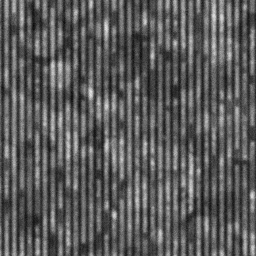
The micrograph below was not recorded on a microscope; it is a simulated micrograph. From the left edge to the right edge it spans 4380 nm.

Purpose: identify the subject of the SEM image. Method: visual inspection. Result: parallel lines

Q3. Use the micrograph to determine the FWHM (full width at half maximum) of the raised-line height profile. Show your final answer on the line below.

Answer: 59.9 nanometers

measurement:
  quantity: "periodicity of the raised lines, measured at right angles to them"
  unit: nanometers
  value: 132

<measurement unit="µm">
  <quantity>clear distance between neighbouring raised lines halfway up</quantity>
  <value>0.0599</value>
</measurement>